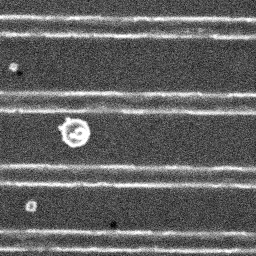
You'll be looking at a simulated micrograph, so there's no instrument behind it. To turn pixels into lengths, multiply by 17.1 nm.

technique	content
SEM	lines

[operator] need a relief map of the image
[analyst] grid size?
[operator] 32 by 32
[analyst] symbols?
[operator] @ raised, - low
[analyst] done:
--------------------------------
--------------------------------
@@@@@@@@@@@@@@@@@@@@@@@@@@@@@@@-
@@@@@@@@@@@@@@@@@@@@@@@@@@@@@@@@
--------------------------@@@@@@
--------------------------------
--------------------------------
--------------------------------
--------------------------------
--------------------------------
--------------------------------
--------------------------------
@@@@@@@@@@@@@@@@@@@@@@@@@@@@@@@@
@@@@@@@@@@@@@@@@@@@@@@@@@@@@@@@@
--------------------------------
--------@@@---------------------
--------@@@---------------------
--------@@@---------------------
--------------------------------
--------------------------------
--------------------------------
@@@@@@@@@@@@@@@@@@@@@@@@@@@@@@@@
@@@@@@@@@@@@@@@@@@@@@@@@@@@@@@@@
--------------------------------
--------------------------------
--------------------------------
--------------------------------
--------------------------------
--------------------------------
@@@@@@@@@@@@@@@@@@@@@@@@@@@@@@@@
@@@@@@@@@@@@@@@@@@@@@@@@@@@@@@@@
--------------------------------